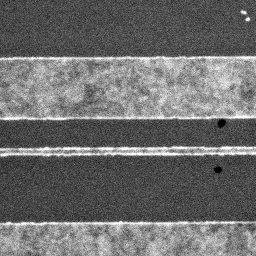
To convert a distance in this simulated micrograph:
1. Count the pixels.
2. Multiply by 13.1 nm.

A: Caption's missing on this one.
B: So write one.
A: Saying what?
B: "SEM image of lines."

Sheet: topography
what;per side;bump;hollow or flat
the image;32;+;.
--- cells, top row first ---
................................
................................
................................
................................
................................
................................
................................
++++++++++++++++++++++++++++++++
++++++++++++++++++++++++++++++++
++++++++++++++++++++++++++++++++
++++++++++++++++++++++++++++++++
++++++++++++++++++++++++++++++++
++++++++++++++++++++++++++++++++
++++++++++++++++++++++++++++++++
++++++++++++++++++++++++++++++++
................................
................................
................................
.....................+++++.+++++
................................
................................
................................
................................
................................
................................
................................
................................
................................
++++++++++++++++++++++++++++++++
++++++++++++++++++++++++++++++++
++++++++++++++++++++++++++++++++
++++++++++++++++++++++++++++++++